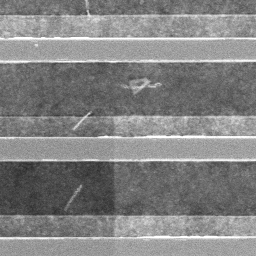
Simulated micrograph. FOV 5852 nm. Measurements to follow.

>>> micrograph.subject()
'lines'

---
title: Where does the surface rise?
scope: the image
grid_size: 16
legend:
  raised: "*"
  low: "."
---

................
****************
****************
****************
................
................
................
****************
****************
****************
................
................
................
................
****************
****************